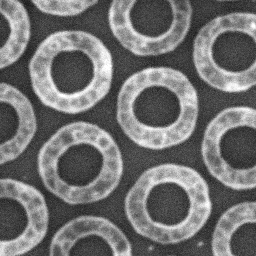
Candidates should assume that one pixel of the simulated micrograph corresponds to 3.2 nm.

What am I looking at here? ring-shaped raised bodies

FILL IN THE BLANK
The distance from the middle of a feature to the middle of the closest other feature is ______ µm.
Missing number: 0.299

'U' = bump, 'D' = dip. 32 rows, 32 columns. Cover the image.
UUUDUUUUUUUUDDUUDDDDDUUUDDDDDDDD
UUUDDDUUUUDDDDUUDDDDDDUUDDDDDDDD
DUUUDDDDDDDDDDUUDDDDDDUUDDDUUUUU
DUUUDDDDDDDDDDUUDDDDDUUDDUUUUUUU
DUUUDDDUUUUDDDDUUUDDUUUDDUUDDDDD
DUUDDUUUUUUUUDDUUUUUUUDDUUDDDDDD
UUUDDUUDDDDUUDDDDUUUUDDDUUDDDDDD
UUDDUUUDDDDDUUDDDDDDDDDDUUUDDDDD
DDDDUUDDDDDDUUDDDDDDDDDDDUUDDDDU
DDDDUUDDDDDDUUDDDUUUUUUDDUUUUUUU
UDDDUUUDDDDUUUDDUUUUUUUUDDUUUUUU
UUDDDUUDDDUUUDDUUDDDDDUUDDDDDDDD
UUUDDUUUUUUUDDDUUDDDDDUUUDDDDDDD
DDUUDDDUUUUDDDDUDDDDDDDUUDDDDDDD
DDUUDDDDDDDDDDDUUDDDDDUUUDDUUUUU
DDDUDDDDDDUDDDDUUUDDDDUUDDUUUUUU
DDUUDDDUUUUUUDDDUUUUUUUUDDUUDDDD
DDUUDDUUUUUUUUDDDUUUUUUDDUUDDDDD
UUUDDDUUDDDDUUUDDDDDDDDDDUUDDDDD
UUDDDUUDDDDDDUUDDDDDDDDDDUUUDDDD
DDDDDUUDDDDDDUUDDDDDDDDDDDUUDDDD
DDDDDUUDDDDDDUUDDDUUUUUUDDUUUUUU
DDDDDDUUDDDDUUUDDUUUUUUUUDDDUUUU
UUUUDDUUUUUUUUDDDUUDDDDUUUDDDDDD
UUUUUDDUUUUUUDDDUUDDDDDDUUDDDDDD
DDDUUUDDDDDDDDDDUUDDDDDDUUDDDDUU
DDDUUUDDDDDDDDDDUUDDDDDDUUDDUUUU
DDDDUUDDDUUUUDDDUUUDDDDUUUDUUUUU
DDDUUUDDUUUUUUUDDUUUUUUUUDDUUUDD
DDDUUDDUUUDDDUUUDDUUUUUUDDDUUDDD
UUUUUDDUUDDDDDUUDDDDDDDDDDDUUDDD
UUUDDDUUUDDDDDUUDDDDDDDDDDDUUDDD